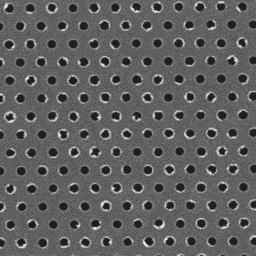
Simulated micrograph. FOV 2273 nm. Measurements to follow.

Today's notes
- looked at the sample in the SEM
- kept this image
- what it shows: a regular array of holes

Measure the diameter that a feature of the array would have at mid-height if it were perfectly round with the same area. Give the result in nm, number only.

74.9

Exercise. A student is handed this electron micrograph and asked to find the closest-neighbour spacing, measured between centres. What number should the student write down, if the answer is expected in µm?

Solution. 0.181